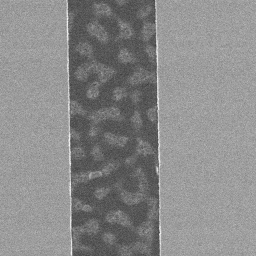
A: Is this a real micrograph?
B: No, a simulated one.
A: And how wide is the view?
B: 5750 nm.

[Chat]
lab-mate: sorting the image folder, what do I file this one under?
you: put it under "one or a few lines or trenches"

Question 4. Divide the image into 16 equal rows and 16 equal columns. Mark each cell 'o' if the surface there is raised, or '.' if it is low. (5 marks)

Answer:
oooo......oooooo
oooo......oooooo
oooo......oooooo
oooo......oooooo
oooo......oooooo
oooo......oooooo
oooo......oooooo
oooo......oooooo
oooo......oooooo
oooo......oooooo
oooo......oooooo
oooo......oooooo
oooo......oooooo
oooo......oooooo
oooo......oooooo
oooo......oooooo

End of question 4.